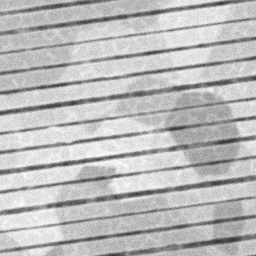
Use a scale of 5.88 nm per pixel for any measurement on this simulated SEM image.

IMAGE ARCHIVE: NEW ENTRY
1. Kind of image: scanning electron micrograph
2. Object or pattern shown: parallel lines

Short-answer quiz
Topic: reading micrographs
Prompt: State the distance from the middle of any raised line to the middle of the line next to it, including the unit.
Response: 115 nanometres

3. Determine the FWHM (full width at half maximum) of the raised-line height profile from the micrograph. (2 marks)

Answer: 86.6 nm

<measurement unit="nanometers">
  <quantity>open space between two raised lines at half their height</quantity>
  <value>30.5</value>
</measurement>